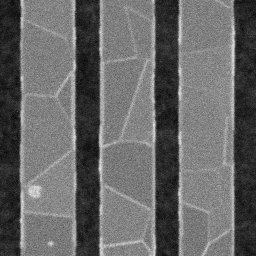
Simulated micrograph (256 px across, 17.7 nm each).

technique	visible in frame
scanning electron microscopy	wiring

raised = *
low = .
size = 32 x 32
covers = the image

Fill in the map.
...******....******....******...
...******....******....******...
...******....******....******...
...******....******....******...
...******....******....******...
...******....******...*******...
...******....******...*******...
...******....******...*******...
...******....******...*******...
...******....******....******...
...******....******....******...
...******....******....******...
...******....******...*******...
...******....******...*******...
...******....******...*******...
...******....******...*******...
...******....******...*******...
...******....******....******...
...******....******....******...
...******....******....******...
...******....******....******...
...******....******....******...
...******....******....******...
...******....******....******...
...******....******....******...
...******....******....******...
...******....******....******...
...******....******....******...
...******....******....******...
...******....******....******...
...******....******....******...
...******....******....******...